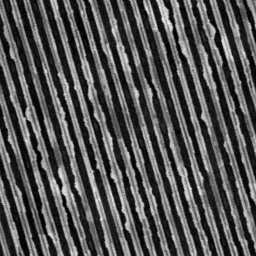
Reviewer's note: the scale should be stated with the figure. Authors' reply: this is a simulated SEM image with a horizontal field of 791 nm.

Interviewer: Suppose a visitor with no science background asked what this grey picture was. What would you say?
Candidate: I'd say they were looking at parallel lines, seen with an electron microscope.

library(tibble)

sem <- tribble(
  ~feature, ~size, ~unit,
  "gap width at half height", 23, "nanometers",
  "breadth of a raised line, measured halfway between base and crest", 17.4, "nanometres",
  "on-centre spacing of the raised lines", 39.6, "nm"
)